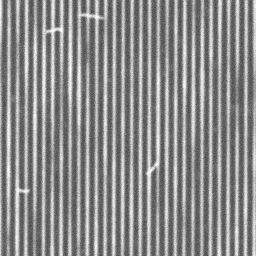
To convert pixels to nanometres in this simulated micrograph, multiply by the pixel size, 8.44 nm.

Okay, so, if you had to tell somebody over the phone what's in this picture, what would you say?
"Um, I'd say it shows parallel lines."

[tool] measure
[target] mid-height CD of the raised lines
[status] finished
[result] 0.0158 um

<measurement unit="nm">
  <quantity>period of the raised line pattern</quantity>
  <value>74.1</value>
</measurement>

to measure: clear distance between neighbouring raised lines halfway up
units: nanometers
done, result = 55.9